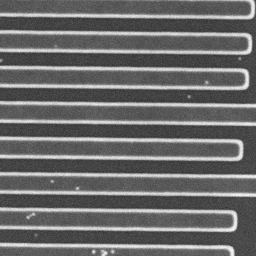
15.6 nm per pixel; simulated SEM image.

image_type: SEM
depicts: groups of lines, slits or small figures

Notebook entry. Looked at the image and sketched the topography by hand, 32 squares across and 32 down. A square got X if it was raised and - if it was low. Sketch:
XXXXXXXXXXXXXXXXXXXXXXXXXXXXXXXX
XXXXXXXXXXXXXXXXXXXXXXXXXXXXXXXX
--------------------------------
--------------------------------
XXXXXXXXXXXXXXXXXXXXXXXXXXXXXXX-
XXXXXXXXXXXXXXXXXXXXXXXXXXXXXXX-
---------------------XXXXXXXXXX-
--------------------------------
XXXXXX--------------------------
XXXXXXXXXXXXXXXXXXXXXXXXXXXXXXX-
XXXXXXXXXXXXXXXXXXXXXXXXXXXXXXX-
--------------------------------
--------------------------------
XXXXXXXXXXXXXXXXXXXXXXXXXXXXXXXX
XXXXXXXXXXXXXXXXXXXXXXXXXXXXXXXX
-------------------------------X
--------------------------------
XXXXXXXXXXXXXXX-----------------
XXXXXXXXXXXXXXXXXXXXXXXXXXXXXX--
XXXXXXXXXXXXXXXXXXXXXXXXXXXXXX--
--------------------------------
--------------------------------
XXXXXXXXXXXXXXXXXXXXXXXXXXXXXXXX
XXXXXXXXXXXXXXXXXXXXXXXXXXXXXXXX
--------------------------------
--------------------------------
XXXXXXXXXXXXXXXXXXXXXXXXXXXX----
XXXXXXXXXXXXXXXXXXXXXXXXXXXXX---
-----XXXXXXXXXXXXXXXXXXXXXXXX---
--------------------------------
--------------------------------
XXXXXXXXXXXXXXXXXXXXXXXXXXXXX---